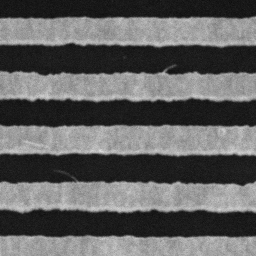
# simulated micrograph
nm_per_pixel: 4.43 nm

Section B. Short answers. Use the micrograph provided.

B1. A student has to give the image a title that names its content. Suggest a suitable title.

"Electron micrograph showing lines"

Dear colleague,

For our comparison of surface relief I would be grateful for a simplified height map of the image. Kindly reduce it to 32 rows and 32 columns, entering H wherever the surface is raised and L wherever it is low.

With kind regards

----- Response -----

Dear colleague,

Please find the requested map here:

LLLLLLLLLLLLLLLLLLLLLLLLLLLLLLLL
LLLLLLLLLLLLLLLLLLLLLLLLLLLLLLLL
HHHHHHHHHHHHHHHHHHHHHHHHHHHHHHHH
HHHHHHHHHHHHHHHHHHHHHHHHHHHHHHHH
HHHHHHHHHHHHHHHHHHHHHHHHHHHHHHHH
HHHHHHHHLLHHHHHHHHHHHHHHHHHHHHHH
LLLLLLLLLLLLLLLLLLLLLLLLLLLLLLLL
LLLLLLLLLLLLLLLLLLLLLLLLLLLLLLLL
LLLLLLLLLLLLLLLLLLLLLLLLLLLLLLLL
HHHHHHHHHHHHHHHHHHHHHHHHHHHHHHHH
HHHHHHHHHHHHHHHHHHHHHHHHHHHHHHHH
HHHHHHHHHHHHHHHHHHHHHHHHHHHHHHHH
LLLLLLLLLHLHHHLLHHHHHHHLLLHHHHHL
LLLLLLLLLLLLLLLLLLLLLLLLLLLLLLLL
LLLLLLLLLLLLLLLLLLLLLLLLLLLLLLLL
LLLLLLLLLLLLLLLLLLLLLLLLLLLLLLLL
HHHHHHHHHHHHHHHHHHHHHHHHHHHHHHHH
HHHHHHHHHHHHHHHHHHHHHHHHHHHHHHHH
HHHHHHHHHHHHHHHHHHHHHHHHHHHHHHHH
LLLLLLLLLLLLLLLLLLLLLLLLLLLLLLLL
LLLLLLLLLLLLLLLLLLLLLLLLLLLLLLLL
LLLLLLLLLLLLLLLLLLLLLLLLLLLLLLLL
LLLLLLLLLLLLLLLLLLLLLLLLLLLLLLLL
HHHHHHHHHHHHHHHHHHHHHHHHHHHHHHHH
HHHHHHHHHHHHHHHHHHHHHHHHHHHHHHHH
HHHHHHHHHHHHHHHHHHHHHHHHHHHHHHHH
LLHLLLLLLLLLLLLHLLLLLLLLLLLHHLLL
LLLLLLLLLLLLLLLLLLLLLLLLLLLLLLLL
LLLLLLLLLLLLLLLLLLLLLLLLLLLLLLLL
LLLLLLLLLLLLLLLLLLLLLLLLLLLLLLLL
HHHHHHHHHHHHHHHHHHHHHHHHHHHHHHHH
HHHHHHHHHHHHHHHHHHHHHHHHHHHHHHHH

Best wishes